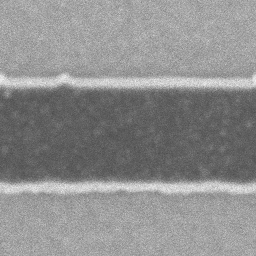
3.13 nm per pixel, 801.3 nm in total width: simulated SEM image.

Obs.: one or a few lines or trenches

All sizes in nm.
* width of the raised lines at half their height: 334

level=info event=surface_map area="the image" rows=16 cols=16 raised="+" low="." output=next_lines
................
................
................
................
................
++++++++++++++++
++++++++++++++++
++++++++++++++++
++++++++++++++++
++++++++++++++++
++++++++++++++++
++++++++++++++++
................
................
................
................